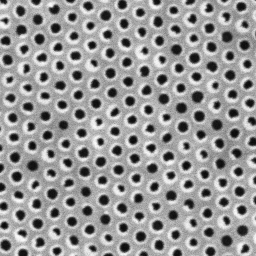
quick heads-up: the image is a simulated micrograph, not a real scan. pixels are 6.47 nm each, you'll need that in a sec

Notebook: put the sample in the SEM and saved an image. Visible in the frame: a regular array of holes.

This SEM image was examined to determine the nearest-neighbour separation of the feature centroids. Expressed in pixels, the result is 18.7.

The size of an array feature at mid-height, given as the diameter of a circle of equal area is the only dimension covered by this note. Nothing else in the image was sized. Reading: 61.3 nanometers